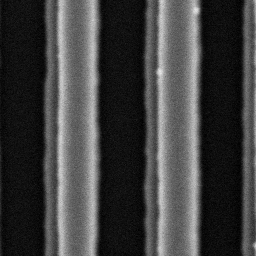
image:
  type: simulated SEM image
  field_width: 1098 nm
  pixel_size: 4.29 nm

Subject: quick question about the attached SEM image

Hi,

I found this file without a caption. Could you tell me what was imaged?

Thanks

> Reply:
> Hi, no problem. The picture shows lines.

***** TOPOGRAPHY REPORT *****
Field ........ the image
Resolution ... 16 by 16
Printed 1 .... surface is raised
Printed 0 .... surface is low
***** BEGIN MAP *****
0001110001110001
0001110001110001
0001110001110001
0001110001110001
0001110001110001
0001110001110001
0001110001110001
0001110001110001
0001110001110001
0001110001110001
0001110001110001
0001110001110001
0001110001110001
0001110001110001
0001110001110001
0001110001110001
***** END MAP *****